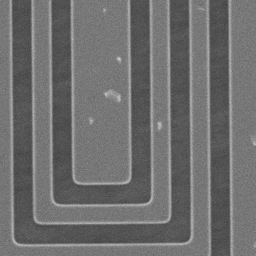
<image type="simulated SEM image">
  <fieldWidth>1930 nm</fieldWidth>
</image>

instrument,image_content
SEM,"groups of lines, slits or small figures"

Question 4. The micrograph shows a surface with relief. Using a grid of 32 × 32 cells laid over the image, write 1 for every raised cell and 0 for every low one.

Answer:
10001100011111110001100011000111
10001100011111110001100011000111
10001100011111110001100011000111
10001100011111110001100011000111
10001100011111110001100011000111
10001100011111110001100011000111
10001100011111110001100011000111
10001100011111110001100011000111
10001100011111110001100011000111
10001100011111110001100011000111
11001100011111110001100011000111
11001100011111110001100011000111
11001100011111110001100011000111
11001100011111110001100011000111
11001100011111110001100011000111
11001100011111110001100011000111
11001100011111110001100011000111
11001100011111110001100011000111
11001100011111110001100011000111
11001100011111110001100011000111
11001100011111110001100011000111
11001100011111110001100011000111
11001100011111110001100011000111
11001110000000000001100011000111
11001110000000000001100011000111
11001110000000000011100011000111
11001111111111111111100011000111
11001111111111111111100011000111
11000000000000000000000011000111
11000000000000000000000011000111
11000000000000000001111111000111
11111111111111111111111111000111